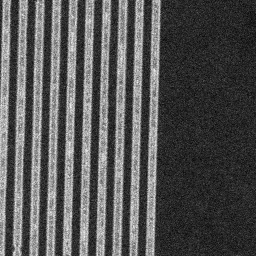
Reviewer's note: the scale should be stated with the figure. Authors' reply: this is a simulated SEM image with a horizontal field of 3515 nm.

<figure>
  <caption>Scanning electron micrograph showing parallel lines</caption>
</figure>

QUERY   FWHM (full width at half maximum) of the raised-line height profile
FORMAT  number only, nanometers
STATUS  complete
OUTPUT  80.6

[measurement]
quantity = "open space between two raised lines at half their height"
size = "0.139 microns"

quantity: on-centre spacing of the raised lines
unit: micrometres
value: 0.228